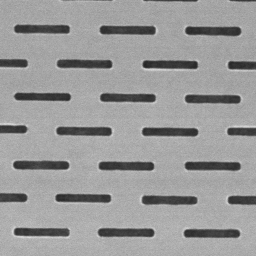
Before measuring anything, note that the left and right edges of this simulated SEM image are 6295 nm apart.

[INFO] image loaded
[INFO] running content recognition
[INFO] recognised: a regular array of holes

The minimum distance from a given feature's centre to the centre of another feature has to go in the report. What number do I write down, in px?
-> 53.7